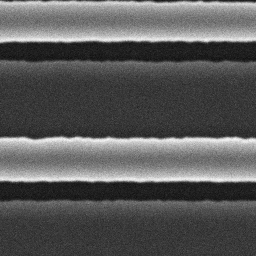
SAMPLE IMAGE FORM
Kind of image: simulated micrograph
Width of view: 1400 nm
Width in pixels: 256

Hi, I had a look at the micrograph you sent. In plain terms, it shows lines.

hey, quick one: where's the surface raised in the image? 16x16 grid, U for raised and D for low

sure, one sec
UUUUUUUUUUUUUUUU
UUUUUUUUUUUUUUUU
UUUUUUUUUUUUUUUU
DDDDDDDDDDDDDDDD
DDDDDDDDDDDDDDDD
DDDDDDDDDDDDDDDD
DDDDDDDDDDDDDDDD
DDDDDDDDDDDDDDDD
DDDDDDDDDDDDDDDD
UUUUUUUUUUUUUUUU
UUUUUUUUUUUUUUUU
DDDDDDDDDDDDDDDD
DDDDDDDDDDDDDDDD
DDDDDDDDDDDDDDDD
DDDDDDDDDDDDDDDD
DDDDDDDDDDDDDDDD